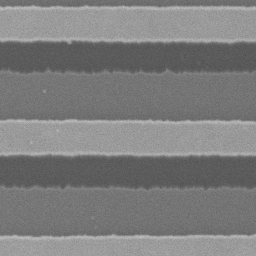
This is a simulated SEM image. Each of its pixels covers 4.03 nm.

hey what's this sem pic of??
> lines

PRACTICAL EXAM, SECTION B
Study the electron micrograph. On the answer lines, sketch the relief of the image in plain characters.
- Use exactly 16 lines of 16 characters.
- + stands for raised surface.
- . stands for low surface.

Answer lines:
++++++++++++++++
++++++++++++++++
++++++++++++++++
................
+...............
++++++++++++++++
++++++++++++++++
++++++++++++++++
++++++++++++++++
++++++++++++++++
................
................
++++++++++++++++
++++++++++++++++
++++++++++++++++
++++++++++++++++